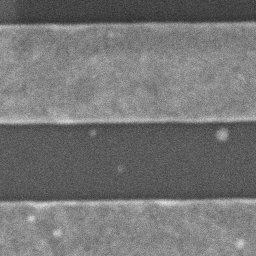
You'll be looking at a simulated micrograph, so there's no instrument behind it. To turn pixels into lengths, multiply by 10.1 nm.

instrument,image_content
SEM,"wiring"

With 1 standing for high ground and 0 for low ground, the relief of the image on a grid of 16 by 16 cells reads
0000000000000000
0000000011010011
1111111111111111
1111111111111111
1111111111111111
1111111111111111
1111111111111111
1111111111111100
0000000000000000
0000000000000000
0000000000000000
0000000000000000
0000000000000000
1111111111111111
1111111111111111
1111111111111111